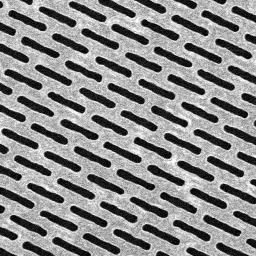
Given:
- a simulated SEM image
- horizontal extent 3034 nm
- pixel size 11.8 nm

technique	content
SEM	a regular array of holes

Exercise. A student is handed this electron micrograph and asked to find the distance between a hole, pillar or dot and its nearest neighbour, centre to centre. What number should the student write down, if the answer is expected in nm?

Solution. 353